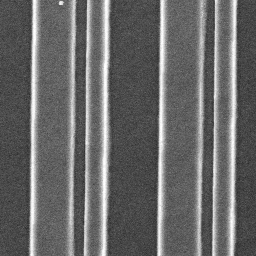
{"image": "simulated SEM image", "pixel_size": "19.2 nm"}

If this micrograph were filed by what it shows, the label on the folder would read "lines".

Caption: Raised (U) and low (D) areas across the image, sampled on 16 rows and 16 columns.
DDUUUUUDDDUUUUUD
DDUUUUUDDDUUUUUD
DDUUUUUDDDUUUUUD
DDUUUUUDDDUUUUUD
DDUUUUUDDDUUUUUD
DDUUUUUDDDUUUUUD
DDUUUUUDDDUUUUUD
DDUUUUUDDDUUUUUD
DDUUUUUDDDUUUUUD
DDUUUUDDDDUUUUUD
DDUUUUDDDDUUUUDD
DDUUUUDDDDUUUUDD
DDUUUUDDDDUUUUDD
DDUUUUDDDDUUUUDD
DDUUUUDDDDUUUUDD
DDUUUUDDDDUUUUDD